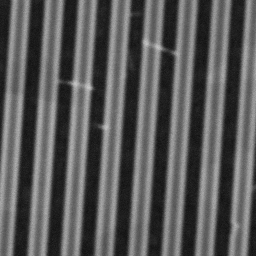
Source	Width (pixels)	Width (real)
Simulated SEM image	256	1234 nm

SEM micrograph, parallel lines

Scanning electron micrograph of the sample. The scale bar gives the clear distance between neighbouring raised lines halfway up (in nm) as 96.7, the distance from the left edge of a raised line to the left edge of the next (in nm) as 161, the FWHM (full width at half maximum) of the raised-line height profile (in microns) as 0.063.